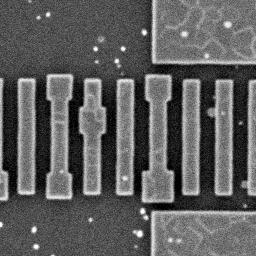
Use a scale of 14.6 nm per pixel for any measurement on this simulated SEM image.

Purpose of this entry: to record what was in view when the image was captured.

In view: wiring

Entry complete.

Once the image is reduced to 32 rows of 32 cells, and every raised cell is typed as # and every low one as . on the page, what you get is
...................#############
...................#############
...................#############
...................#############
...................#############
...................#############
...................#############
...................#############
................................
......###..........##...........
..##..###..##..##.###..##..##..#
..##..###..##..##.###..##..##..#
..##..###..##..##.###..##..##..#
..##..##..###..##..##..##..##..#
..##..##..###..##..##..##..##..#
..##..##..###..##..##..##..##..#
..##...#..###..##..##..##..##..#
..##...#...##..##..##..##..##..#
..##..##...##..##..##..##..##..#
..##..##...##..##..##..##..##..#
..##..##...##..##..##..##..##..#
#.##..###..##..##.###..##..##..#
#.##..###..##..##.####.##..##..#
#.##..###..##..##.####.##..##..#
#.....###.........####..........
................................
...................###.#........
...................#############
...................#############
...................#############
...................#############
...................#############